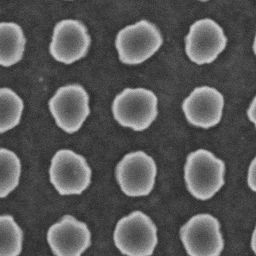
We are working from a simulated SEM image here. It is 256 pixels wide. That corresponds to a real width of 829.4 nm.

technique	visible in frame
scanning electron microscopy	a regular array of raised bodies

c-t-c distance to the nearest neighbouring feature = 0.211 microns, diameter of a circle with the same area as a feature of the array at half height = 135 nanometres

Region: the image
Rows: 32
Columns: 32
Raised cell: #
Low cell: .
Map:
................................
................................
........#................#......
##.....###......###.....###.....
###....####....#####....####....
###...#####....#####...#####....
###...#####....####....#####....
##.....##......###......###.....
................................
................................
................................
#......####....####.....###.....
###...#####...######...#####....
###...#####...#####....#####...#
###....####...#####....#####...#
##.....###.....####.....###.....
................................
................................
................................
##.....###......###.....###.....
##....#####....####....#####...#
##....#####....####....#####...#
##....#####....####....#####...#
##.....####....####.....###....#
#........................#......
................................
................................
##......#......###......###.....
##....#####....####....####.....
###...#####...#####....#####....
###...#####...#####....#####...#
##.....###.....####.....###.....